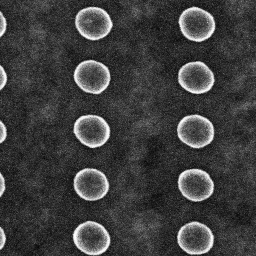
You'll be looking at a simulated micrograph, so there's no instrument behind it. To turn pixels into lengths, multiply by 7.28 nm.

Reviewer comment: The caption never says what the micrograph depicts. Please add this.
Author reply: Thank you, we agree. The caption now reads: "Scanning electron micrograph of a regular array of raised bodies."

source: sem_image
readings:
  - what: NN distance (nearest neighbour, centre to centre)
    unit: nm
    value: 390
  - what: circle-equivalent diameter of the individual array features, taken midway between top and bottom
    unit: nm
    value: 240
